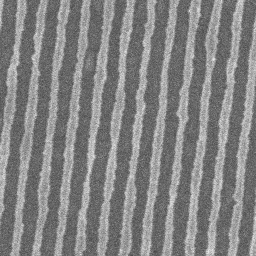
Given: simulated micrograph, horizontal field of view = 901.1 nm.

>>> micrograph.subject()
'parallel lines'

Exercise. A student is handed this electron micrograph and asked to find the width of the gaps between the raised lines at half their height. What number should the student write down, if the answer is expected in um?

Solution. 0.0497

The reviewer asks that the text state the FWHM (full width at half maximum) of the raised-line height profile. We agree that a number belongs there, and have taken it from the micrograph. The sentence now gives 0.0262 um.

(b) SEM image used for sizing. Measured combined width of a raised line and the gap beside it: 76 nm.